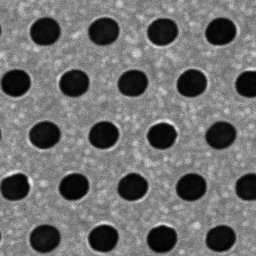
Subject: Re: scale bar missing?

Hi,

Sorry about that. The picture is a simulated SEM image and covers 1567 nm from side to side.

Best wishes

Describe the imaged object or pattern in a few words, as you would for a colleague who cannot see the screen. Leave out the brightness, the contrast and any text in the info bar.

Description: a regular array of holes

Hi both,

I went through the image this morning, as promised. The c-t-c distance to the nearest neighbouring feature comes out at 58.5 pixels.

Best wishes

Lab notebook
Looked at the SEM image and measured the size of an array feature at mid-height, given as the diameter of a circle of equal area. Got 0.18 micrometres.